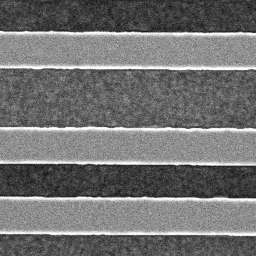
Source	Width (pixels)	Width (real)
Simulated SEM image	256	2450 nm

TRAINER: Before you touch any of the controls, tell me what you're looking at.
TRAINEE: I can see lines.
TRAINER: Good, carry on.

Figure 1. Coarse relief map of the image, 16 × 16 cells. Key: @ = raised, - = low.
----------------
----------------
@@@@@@@@@@@@@@@@
@@@@@@@@@@@@@@@@
----------------
----------------
----------------
----------------
@@@@@@@@@@@@@@@@
@@@@@@@@@@@@@@@@
----------------
----------------
@@@@@@@@@@@@@@@@
@@@@@@@@@@@@@@@@
@@@@@@@@@@@@@@@@
----------------